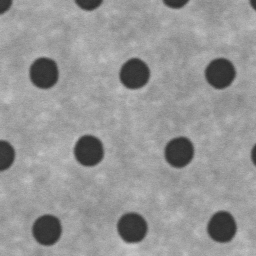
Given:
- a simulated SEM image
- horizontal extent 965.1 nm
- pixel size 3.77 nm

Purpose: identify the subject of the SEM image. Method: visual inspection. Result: a regular array of holes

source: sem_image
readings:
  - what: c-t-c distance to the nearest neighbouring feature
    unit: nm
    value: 324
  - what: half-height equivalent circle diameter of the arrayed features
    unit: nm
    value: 115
